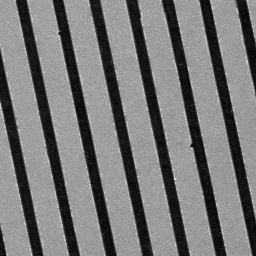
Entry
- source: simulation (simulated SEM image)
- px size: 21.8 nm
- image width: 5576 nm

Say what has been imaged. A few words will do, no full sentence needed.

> parallel lines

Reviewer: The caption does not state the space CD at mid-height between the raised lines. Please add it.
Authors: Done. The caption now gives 210 nm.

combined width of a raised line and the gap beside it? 781 nanometers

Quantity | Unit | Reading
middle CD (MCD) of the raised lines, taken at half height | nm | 568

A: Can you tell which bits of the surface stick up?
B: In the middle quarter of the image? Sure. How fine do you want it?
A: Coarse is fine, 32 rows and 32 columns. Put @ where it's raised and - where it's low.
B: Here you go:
@--@@@@@@@--@@@@@@@--@@@@@@@---@
@--@@@@@@@---@@@@@@---@@@@@@---@
@---@@@@@@---@@@@@@---@@@@@@---@
@---@@@@@@---@@@@@@@--@@@@@@@--@
@---@@@@@@@--@@@@@@@--@@@@@@@--@
@@--@@@@@@@--@@@@@@@---@@@@@@---
@@--@@@@@@@---@@@@@@---@@@@@@---
@@---@@@@@@---@@@@@@---@@@@@@@--
@@---@@@@@@---@@@@@@@--@@@@@@@--
@@@--@@@@@@@--@@@@@@@--@@@@@@@--
@@@--@@@@@@@--@@@@@@@---@@@@@@--
@@@---@@@@@@---@@@@@@---@@@@@@--
@@@---@@@@@@---@@@@@@---@@@@@@@-
@@@---@@@@@@@--@@@@@@@--@@@@@@@-
@@@@--@@@@@@@--@@@@@@@--@@@@@@@-
@@@@--@@@@@@@--@@@@@@@---@@@@@@-
@@@@---@@@@@@---@@@@@@---@@@@@@-
@@@@---@@@@@@---@@@@@@---@@@@@@@
@@@@---@@@@@@@--@@@@@@@--@@@@@@@
@@@@@--@@@@@@@--@@@@@@@--@@@@@@@
@@@@@--@@@@@@@---@@@@@@---@@@@@@
@@@@@---@@@@@@---@@@@@@---@@@@@@
@@@@@---@@@@@@---@@@@@@@--@@@@@@
@@@@@---@@@@@@@--@@@@@@@--@@@@@@
@@@@@@--@@@@@@@--@@@@@@@--@@@@@@
@@@@@@--@@@@@@@---@@@@@@---@@@@@
@@@@@@---@@@@@@---@@@@@@---@@@@@
@@@@@@---@@@@@@---@@@@@@@--@@@@@
@@@@@@@--@@@@@@@--@@@@@@@--@@@@@
@@@@@@@--@@@@@@@--@@@@@@@---@@@@
@@@@@@@--@@@@@@@---@@@@@@---@@@@
-@@@@@@---@@@@@@---@@@@@@---@@@@